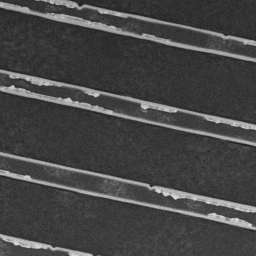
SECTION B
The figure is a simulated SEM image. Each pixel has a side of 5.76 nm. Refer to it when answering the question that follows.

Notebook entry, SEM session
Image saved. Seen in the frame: one or a few lines or trenches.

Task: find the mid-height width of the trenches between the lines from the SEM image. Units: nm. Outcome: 356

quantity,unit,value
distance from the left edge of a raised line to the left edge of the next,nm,469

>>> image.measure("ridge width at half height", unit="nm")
112